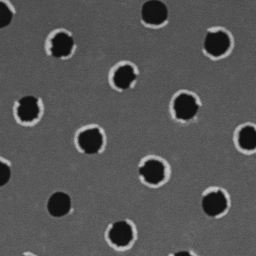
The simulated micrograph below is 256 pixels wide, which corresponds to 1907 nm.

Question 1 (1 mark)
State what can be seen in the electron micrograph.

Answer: a regular array of holes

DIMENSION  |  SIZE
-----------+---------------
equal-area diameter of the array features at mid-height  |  183 nm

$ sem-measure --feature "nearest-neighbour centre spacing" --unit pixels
69.4